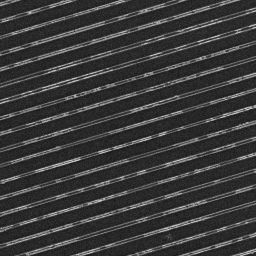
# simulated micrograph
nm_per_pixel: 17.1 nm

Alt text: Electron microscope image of parallel lines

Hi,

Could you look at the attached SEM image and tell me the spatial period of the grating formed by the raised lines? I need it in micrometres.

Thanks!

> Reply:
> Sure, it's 0.264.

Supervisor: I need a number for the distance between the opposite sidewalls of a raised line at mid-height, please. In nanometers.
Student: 45.2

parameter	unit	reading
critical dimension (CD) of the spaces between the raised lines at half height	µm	0.212